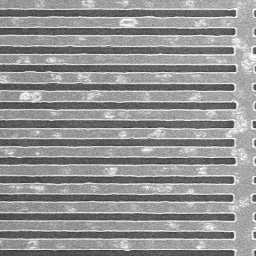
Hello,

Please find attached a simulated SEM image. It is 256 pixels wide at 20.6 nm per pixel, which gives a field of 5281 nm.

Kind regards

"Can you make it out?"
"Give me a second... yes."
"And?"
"parallel lines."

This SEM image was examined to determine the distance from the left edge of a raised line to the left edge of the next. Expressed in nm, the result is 382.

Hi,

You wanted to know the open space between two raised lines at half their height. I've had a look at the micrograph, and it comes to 150 nanometers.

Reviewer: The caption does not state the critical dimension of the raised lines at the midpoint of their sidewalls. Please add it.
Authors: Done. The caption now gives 224 nm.